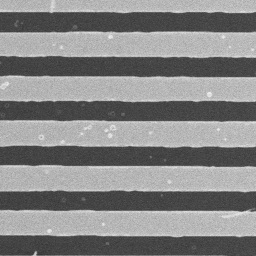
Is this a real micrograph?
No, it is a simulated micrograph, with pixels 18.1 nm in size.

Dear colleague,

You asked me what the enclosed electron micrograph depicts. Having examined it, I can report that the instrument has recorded lines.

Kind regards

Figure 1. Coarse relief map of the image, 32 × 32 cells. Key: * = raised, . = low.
********************************
......*.......***....**..**.****
................................
................................
********************************
********************************
********************************
................................
................................
................................
********************************
********************************
********************************
................................
................................
********************************
********************************
********************************
................................
................................
................................
********************************
********************************
********************************
................................
................................
********************************
********************************
********************************
.....................**......**.
................................
................................